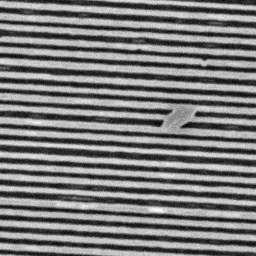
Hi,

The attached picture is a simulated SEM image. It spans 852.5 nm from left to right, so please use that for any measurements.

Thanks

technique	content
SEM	parallel lines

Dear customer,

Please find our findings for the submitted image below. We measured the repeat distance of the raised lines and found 38.4 nanometers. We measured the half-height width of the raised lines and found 17 nanometers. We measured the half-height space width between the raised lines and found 20 nm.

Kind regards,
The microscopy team